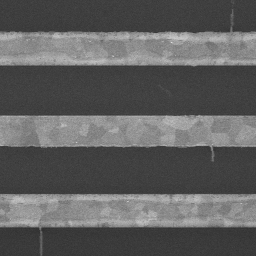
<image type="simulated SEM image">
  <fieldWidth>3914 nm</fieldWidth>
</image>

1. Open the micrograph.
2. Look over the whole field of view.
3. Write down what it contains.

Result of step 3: lines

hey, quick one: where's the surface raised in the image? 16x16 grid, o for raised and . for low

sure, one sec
................
................
oooooooooooooooo
oooooooooooooooo
................
................
................
oooooooooooooooo
oooooooooooooooo
................
................
................
oooooooooooooooo
oooooooooooooooo
................
................